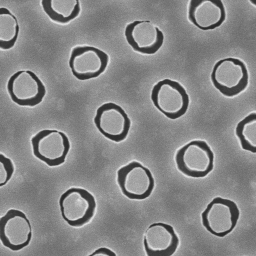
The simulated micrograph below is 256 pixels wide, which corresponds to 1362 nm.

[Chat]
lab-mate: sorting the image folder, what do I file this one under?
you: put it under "a regular array of ring-shaped grooves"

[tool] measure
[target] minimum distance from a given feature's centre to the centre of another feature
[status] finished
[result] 62.7 pixels